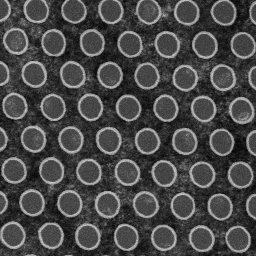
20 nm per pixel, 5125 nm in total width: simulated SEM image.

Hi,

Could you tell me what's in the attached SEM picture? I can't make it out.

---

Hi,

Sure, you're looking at a regular array of raised bodies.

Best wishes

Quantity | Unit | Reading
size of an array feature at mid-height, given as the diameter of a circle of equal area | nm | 488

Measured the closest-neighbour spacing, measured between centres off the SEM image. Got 36.8 px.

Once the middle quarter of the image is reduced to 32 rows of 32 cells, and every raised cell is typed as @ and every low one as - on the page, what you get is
@@@@-----@@@@------@@@----------
@@@@@----@@@@@----@@@@@-----@@@@
@@@@@----@@@@@----@@@@@@----@@@@
@@@@@----@@@@@----@@@@@@----@@@@
@@@@@----@@@@@----@@@@@----@@@@@
-@@@------@@@------@@@------@@@@
------------------------------@-
--------------------------------
-----@@@@-----@@@-------@@@-----
----@@@@@----@@@@@-----@@@@@----
----@@@@@----@@@@@@----@@@@@----
----@@@@@----@@@@@@----@@@@@----
----@@@@@-----@@@@@----@@@@@----
-----@@@-------@@@------@@@-----
--------------------------------
--------------------------------
@@@@------@@@-------@@-------@@-
@@@@-----@@@@@----@@@@@-----@@@@
@@@@@---@@@@@@----@@@@@@---@@@@@
@@@@@---@@@@@@----@@@@@@---@@@@@
@@@@-----@@@@@----@@@@@----@@@@@
@@@@------@@@------@@@@-----@@@@
--------------------------------
--------------------------------
----@@@@------@@@-------@@------
----@@@@@----@@@@@-----@@@@-----
---@@@@@@----@@@@@@---@@@@@@----
---@@@@@@----@@@@@@---@@@@@@----
----@@@@@----@@@@@@----@@@@@----
-----@@@------@@@@-----@@@@-----
--------------------------------
--------------------------------